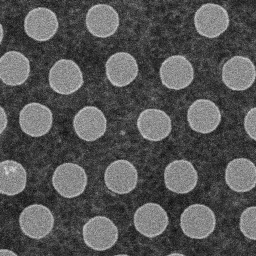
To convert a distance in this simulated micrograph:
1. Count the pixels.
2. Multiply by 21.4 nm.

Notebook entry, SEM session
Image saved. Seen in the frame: a regular array of raised bodies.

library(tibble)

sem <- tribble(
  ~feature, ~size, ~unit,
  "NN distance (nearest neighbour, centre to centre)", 1110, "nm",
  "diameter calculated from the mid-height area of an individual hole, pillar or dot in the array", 0.708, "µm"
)